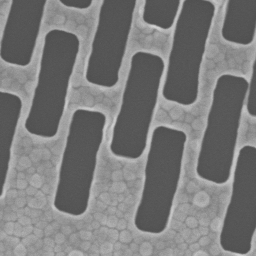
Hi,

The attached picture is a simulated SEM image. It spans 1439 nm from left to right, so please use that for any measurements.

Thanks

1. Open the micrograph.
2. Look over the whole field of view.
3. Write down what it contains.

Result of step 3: holes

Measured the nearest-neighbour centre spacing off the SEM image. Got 444 nanometers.